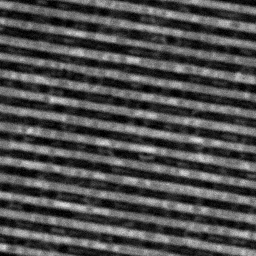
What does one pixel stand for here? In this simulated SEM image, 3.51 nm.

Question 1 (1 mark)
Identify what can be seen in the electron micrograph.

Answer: parallel lines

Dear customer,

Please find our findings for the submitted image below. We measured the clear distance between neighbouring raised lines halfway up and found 34.6 nm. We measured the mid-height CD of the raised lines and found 24.2 nm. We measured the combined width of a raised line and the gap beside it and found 60 nm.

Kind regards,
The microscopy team